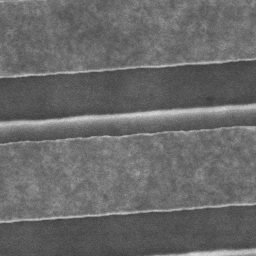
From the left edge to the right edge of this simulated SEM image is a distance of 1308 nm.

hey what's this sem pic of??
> lines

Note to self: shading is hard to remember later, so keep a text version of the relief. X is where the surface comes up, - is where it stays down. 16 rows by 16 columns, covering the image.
XXXXXXXXXXXXXXXX
XXXXXXXXXXXXXXXX
XXXXXXXXXXXXXXXX
XXXXXXXXXXXXXXXX
XXXXXX----------
----------------
----------------
----XXXXXXXXXXXX
XXXXXXXXXXXXXXXX
XXXXXXXXXXXXXXXX
XXXXXXXXXXXXXXXX
XXXXXXXXXXXXXXXX
XXXXXXXXXXXXXXXX
XXXXXX----------
----------------
----------------